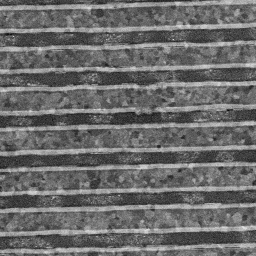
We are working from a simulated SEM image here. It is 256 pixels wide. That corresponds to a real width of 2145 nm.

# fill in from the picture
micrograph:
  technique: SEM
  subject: parallel lines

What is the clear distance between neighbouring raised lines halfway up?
147 nanometres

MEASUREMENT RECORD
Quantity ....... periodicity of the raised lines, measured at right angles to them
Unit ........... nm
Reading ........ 340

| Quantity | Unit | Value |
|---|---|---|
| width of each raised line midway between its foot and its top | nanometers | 194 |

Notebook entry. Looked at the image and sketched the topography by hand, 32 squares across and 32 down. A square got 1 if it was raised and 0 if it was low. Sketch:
00000000000000000000000011111111
11111111111111111111111111111111
11111111111111111111111111111111
11111111111111111011000000000000
00000000000000000000000000000000
00000000000000000000000000001111
11111111111111111111111111111111
11111111111111111111111111111111
11111111111111111110000000000000
00000000000000000000000000000000
00000000000000000000000000111001
11111111111111111111111111111111
11111111111111111111111111111111
11111111111111111111111100000000
00000000000000000000000000000000
00000000000000000000000000000001
11111111111111111111111111111111
11111111111111111111111111111111
11111111111111111111111011000000
00000000000000000000000000000000
00000000000000000000000000000000
11111111111111111111111111111111
11111111111111111111111111111111
11111111111111111111111110111000
00000000000000000000000000000000
00000000000000000000000000000000
11111111111111111111111111111111
11111111111111111111111111111111
11111111111111111111111111111110
00000000000000000000000000000000
00000000000000000000000000000000
11110111111111111111111111111111